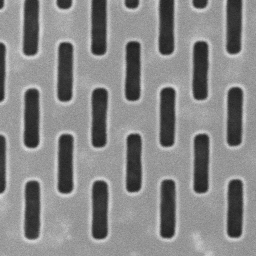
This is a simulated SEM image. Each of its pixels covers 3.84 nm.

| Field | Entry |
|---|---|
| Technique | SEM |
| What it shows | a regular array of holes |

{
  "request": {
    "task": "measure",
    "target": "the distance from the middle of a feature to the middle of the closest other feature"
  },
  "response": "56.6 pixels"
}